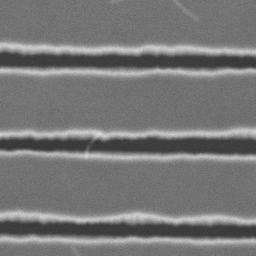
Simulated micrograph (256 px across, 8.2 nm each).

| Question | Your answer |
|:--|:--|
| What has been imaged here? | lines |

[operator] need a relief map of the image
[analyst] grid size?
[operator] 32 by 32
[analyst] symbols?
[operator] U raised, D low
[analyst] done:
UUUUUUUUUUUUUUUUUUUUUUUUUUUUUUUU
UUUUUUUUUUUUUUUUUUUUUUUUUUUUUUUU
UUUUUUUUUUUUUUUUUUUUUUUUUUUUUUUU
UUUUUUUUUUUUUUUUUUUUUUUUUUUUUUUU
UUUUUUUUUUUUUUUUUUUUUUUUUUUUUUUU
UUUUUUUUUUUUUUUUUUUUUUUUUUUUUUUU
DDDUUDUUUUUUUUUUUUUUUUUUUUUUUUUU
DDDDDDDDDDDDDDDDDDDDDDDDDDDDDDDD
DDDDDDDDDDDDDDDDDDDDDDDDDDDDDDDD
UUUUUUUUUUUUUUUUUUUUUUUUUUUUUUUU
UUUUUUUUUUUUUUUUUUUUUUUUUUUUUUUU
UUUUUUUUUUUUUUUUUUUUUUUUUUUUUUUU
UUUUUUUUUUUUUUUUUUUUUUUUUUUUUUUU
UUUUUUUUUUUUUUUUUUUUUUUUUUUUUUUU
UUUUUUUUUUUUUUUUUUUUUUUUUUUUUUUU
UUUUUUUUUUUUUUUUUUUUUUUUUUUUUUUU
UUUUUUUUUUUUUUUUUUUUUUUUUUUUUUUU
DDDDDDDDDDDDDDDDDDDDDDDDDDDDDDDD
DDDDDDDDDDDDDDDDDDDDDDDDDDDDDDDD
UUUUUUUUUUUUUUUUUUUUUUUUUUUUDUDD
UUUUUUUUUUUUUUUUUUUUUUUUUUUUUUUU
UUUUUUUUUUUUUUUUUUUUUUUUUUUUUUUU
UUUUUUUUUUUUUUUUUUUUUUUUUUUUUUUU
UUUUUUUUUUUUUUUUUUUUUUUUUUUUUUUU
UUUUUUUUUUUUUUUUUUUUUUUUUUUUUUUU
UUUUUUUUUUUUUUUUUUUUUUUUUUUUUUUU
UUUUUUUUUUUUUUUUUUUUUUUUUUUUUUUU
DDDDUUUUUUUUUUUUUUUUUUUUUUUUUUUU
DDDDDDDDDDDDDDDDDDDDDDDDDDDDDDDD
DDDDDDDDDDDDDDDDDDDDDDDDDDDDDDDD
UUUUUUUUUUUUUUUUUUUUUUUUUUUUUUUU
UUUUUUUUUUUUUUUUUUUUUUUUUUUUUUUU